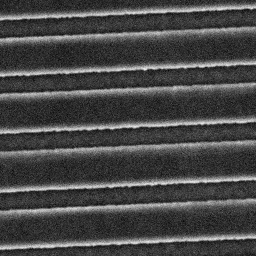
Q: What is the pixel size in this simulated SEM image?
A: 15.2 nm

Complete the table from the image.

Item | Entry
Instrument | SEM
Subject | lines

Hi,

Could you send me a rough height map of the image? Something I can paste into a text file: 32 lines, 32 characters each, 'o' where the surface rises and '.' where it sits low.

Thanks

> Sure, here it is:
oooooooooooooooooooooooooooooooo
ooooooooooooooooooooo...........
................................
...............................o
.........ooooooooooooooooooooooo
oooooooooooooooooooooooooooooooo
oooooooooooooooooooooooooooooooo
oooooooooooooooooooooooooooooooo
ooooooooooooooooooooo...........
o...............................
...............................o
.......ooooooooooooooooooooooooo
oooooooooooooooooooooooooooooooo
oooooooooooooooooooooooooooooooo
oooooooooooooooooooooooooooooooo
oooooooooooooooooooooooooo......
ooo.............................
................................
.............ooooooooooooooooooo
oooooooooooooooooooooooooooooooo
oooooooooooooooooooooooooooooooo
oooooooooooooooooooooooooooooooo
oooooooooooooooooooooooooooooo..
oooooooooooo....................
................................
....................oooooooooooo
oooooooooooooooooooooooooooooooo
oooooooooooooooooooooooooooooooo
oooooooooooooooooooooooooooooooo
oooooooooooooooooooooooooooooooo
ooooooooooooooo.................
................................